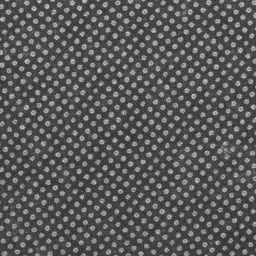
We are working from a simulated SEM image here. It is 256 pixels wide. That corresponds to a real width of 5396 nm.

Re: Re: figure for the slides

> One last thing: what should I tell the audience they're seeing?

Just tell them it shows a regular array of raised bodies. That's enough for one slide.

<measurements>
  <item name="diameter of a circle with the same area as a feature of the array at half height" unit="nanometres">92.1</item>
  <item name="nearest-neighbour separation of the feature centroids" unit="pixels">8.84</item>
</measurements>